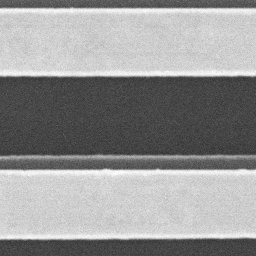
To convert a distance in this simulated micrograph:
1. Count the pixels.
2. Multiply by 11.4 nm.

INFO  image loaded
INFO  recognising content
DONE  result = lines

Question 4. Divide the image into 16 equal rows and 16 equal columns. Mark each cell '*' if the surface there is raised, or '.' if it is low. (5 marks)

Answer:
****************
****************
****************
****************
****************
................
................
................
................
................
****************
****************
****************
****************
****************
................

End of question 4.